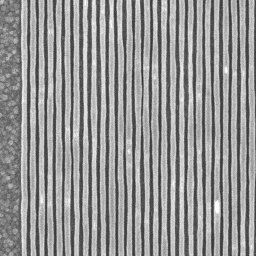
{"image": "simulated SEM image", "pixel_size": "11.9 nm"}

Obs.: parallel lines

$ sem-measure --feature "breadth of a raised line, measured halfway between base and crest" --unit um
0.0625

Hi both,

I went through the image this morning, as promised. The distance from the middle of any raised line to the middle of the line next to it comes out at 104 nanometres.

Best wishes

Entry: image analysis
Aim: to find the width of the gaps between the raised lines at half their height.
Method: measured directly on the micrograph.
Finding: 41.7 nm